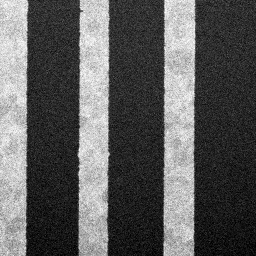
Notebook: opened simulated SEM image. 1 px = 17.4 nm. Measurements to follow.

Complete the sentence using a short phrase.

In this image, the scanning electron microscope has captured one or a few lines or trenches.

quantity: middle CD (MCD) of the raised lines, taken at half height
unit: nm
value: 498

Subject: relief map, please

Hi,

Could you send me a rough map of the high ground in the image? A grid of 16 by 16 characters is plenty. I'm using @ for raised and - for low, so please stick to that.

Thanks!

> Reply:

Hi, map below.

@@---@@---@@----
@@---@@---@@----
@@---@@---@@----
@@---@@---@@----
@@---@@---@@----
@@---@@---@@----
@@---@@---@@----
@@---@@---@@----
@@---@@---@@----
@@---@@---@@----
@@---@@---@@----
@@---@@---@@----
@@---@@---@@----
@@---@@---@@----
@@---@@---@@----
@@---@@---@@----